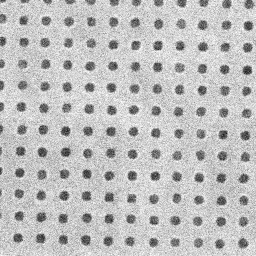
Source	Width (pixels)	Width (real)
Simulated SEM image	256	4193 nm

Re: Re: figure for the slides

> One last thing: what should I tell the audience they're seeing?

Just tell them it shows a regular array of holes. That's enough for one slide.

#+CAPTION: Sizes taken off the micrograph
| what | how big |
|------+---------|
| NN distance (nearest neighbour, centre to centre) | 351 nanometres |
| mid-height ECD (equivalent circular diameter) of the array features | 0.177 µm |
